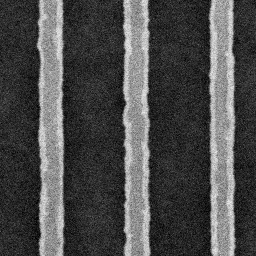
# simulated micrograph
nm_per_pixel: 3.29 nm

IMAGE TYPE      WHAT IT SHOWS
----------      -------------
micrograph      one or a few lines or trenches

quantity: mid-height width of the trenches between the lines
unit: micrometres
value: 0.212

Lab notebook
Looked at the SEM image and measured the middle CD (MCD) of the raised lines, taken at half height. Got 65.8 nanometres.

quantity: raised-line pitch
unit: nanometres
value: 280